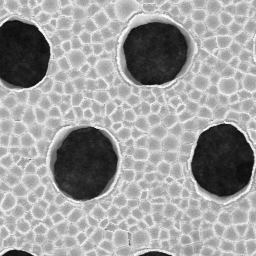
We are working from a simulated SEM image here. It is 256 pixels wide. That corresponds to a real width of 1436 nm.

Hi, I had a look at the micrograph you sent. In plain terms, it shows holes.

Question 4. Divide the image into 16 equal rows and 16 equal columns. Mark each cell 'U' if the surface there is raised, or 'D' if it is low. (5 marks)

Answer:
UUUUUUUUUUUUUUUU
DDUUUUUUUDDUUUUU
DDDUUUUUDDDDUUUU
DDDUUUUUDDDDUUUU
DDDUUUUUDDDUUUUU
UDUUUUUUUUUUUUUU
UUUUUUUUUUUUUUUU
UUUUUUUUUUUUUUUU
UUUUDDDUUUUUUDDU
UUUDDDDUUUUUDDDD
UUUDDDDUUUUUDDDD
UUUDDDDUUUUUDDDU
UUUUUUUUUUUUUUUU
UUUUUUUUUUUUUUUU
UUUUUUUUUUUUUUUU
UUUUUUUUUUUUUUUU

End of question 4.